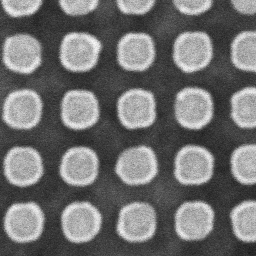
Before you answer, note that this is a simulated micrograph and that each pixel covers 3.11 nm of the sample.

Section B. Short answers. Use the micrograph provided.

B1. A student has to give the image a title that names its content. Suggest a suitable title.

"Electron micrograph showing a regular array of raised bodies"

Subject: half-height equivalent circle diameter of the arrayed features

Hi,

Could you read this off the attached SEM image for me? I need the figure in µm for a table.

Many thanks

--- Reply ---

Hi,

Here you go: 0.123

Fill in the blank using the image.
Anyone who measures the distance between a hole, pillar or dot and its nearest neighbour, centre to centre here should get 174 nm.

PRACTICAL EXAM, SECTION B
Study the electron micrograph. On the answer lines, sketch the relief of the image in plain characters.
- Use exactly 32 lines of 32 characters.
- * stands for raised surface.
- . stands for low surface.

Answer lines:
*****...****...****...****...***
.***....***....***.....**.....**
................................
................................
..**....***.....**.....***....**
.****...*****..****...****...***
*****...****...****...****...***
*****...****...****...****...***
.***....***.....**.....**.....**
................................
................................
..**.....**.....***...****....**
.****...****...****...****...***
*****...****...****...****...***
*****...****...****...****...***
.****...****...****....***....**
................................
................................
..**.............**....**.....**
.****...****...****...****...***
.****...****...*****..*****..***
.****...****...*****..****...***
.****...****...****...****....**
................................
................................
...*.....**......*.....***....**
.****...****...****...*****..***
.****...*****..****...*****..***
.****...****...****...****...***
.****...****...****....***....**
................................
................................